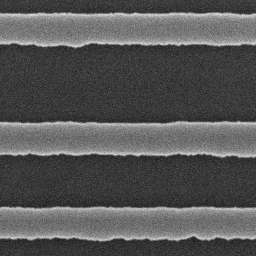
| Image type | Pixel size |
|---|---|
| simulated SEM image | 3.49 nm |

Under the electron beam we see lines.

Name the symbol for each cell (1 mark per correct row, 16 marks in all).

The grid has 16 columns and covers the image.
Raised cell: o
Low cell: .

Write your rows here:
................
oooooooooooooooo
oooooooooooooooo
................
................
................
................
................
oooooooooooooooo
oooooooooooooooo
................
................
................
oooooooooooooooo
oooooooooooooooo
................